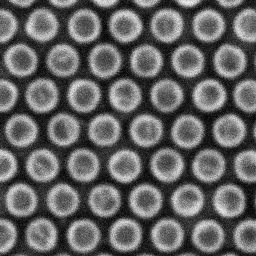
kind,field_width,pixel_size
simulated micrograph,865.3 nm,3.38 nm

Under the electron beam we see a regular array of raised bodies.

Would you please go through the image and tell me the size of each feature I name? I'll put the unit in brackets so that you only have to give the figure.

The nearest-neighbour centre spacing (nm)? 136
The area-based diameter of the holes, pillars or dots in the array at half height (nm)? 99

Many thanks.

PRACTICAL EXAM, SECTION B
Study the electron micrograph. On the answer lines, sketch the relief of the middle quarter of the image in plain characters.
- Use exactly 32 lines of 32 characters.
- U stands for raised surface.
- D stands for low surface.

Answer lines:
UUUDDDDUUUUUUUDDDUUUUUUUDDDDUUUU
UUUDDDDUUUUUUDDDDDUUUUUDDDDDUUUU
DDDDDDDDDUUUDDDDDDDUUUUDDDDDDUUU
DDDDDDDDDDDDDDDDDDDDDDDDDDDDDDDD
DDDDDDDDDDDDDDUUDDDDDDDDDUUDDDDD
DDUUUUUUDDDDUUUUUUDDDDDUUUUUDDDD
DDUUUUUUDDDDUUUUUUUDDDUUUUUUUDDD
DUUUUUUUUDDDUUUUUUUDDDUUUUUUUDDD
DUUUUUUUUDDDUUUUUUUDDDUUUUUUUDDD
DDUUUUUUDDDDUUUUUUDDDDDUUUUUUDDD
DDDUUUUUDDDDDUUUUUDDDDDUUUUUDDDD
DDDDUUDDDDDDDDDDDDDDDDDDUUDDDDDD
DDDDDDDDDDDDDDDDDDDDDDDDDDDDDDDD
UUDDDDDDUUUUDDDDDDDUUUDDDDDDDDUU
UUUDDDDUUUUUUDDDDDUUUUUUDDDDUUUU
UUUDDDDUUUUUUUDDDUUUUUUUDDDDUUUU
UUUDDDDUUUUUUUDDDUUUUUUUDDDUUUUU
UUUDDDDUUUUUUUDDDUUUUUUUDDDUUUUU
UUUDDDDUUUUUUDDDDDUUUUUUDDDDUUUU
UUDDDDDDUUUUDDDDDDUUUUUDDDDDUUUU
DDDDDDDDDDDDDDDDDDDDDDDDDDDDDDUU
DDDDDDDDDDDDDDDDDDDDDDDDDDDDDDDD
DDDUUUUDDDDDDUUUUDDDDDDUUUUUDDDD
DDUUUUUUDDDDUUUUUUDDDDDUUUUUUDDD
DUUUUUUUDDDDUUUUUUUDDDUUUUUUUDDD
DUUUUUUUDDDDUUUUUUUDDDUUUUUUUDDD
DDUUUUUUDDDDUUUUUUUDDDUUUUUUUDDD
DDUUUUUUDDDDUUUUUUDDDDDUUUUUDDDD
DDDUUUUDDDDDDUUUUDDDDDDDUUUUDDDD
DDDDDDDDDDDDDDDDDDDDDDDDDDDDDDDD
UDDDDDDDDDDDDDDDDDDDUDDDDDDDDDDD
UUDDDDDDUUUUDDDDDDUUUUUDDDDDDUUU